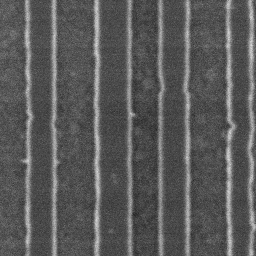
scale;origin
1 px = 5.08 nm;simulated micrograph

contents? one or a few lines or trenches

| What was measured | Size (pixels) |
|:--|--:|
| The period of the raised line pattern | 66.3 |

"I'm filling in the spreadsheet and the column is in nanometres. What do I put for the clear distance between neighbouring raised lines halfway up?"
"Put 202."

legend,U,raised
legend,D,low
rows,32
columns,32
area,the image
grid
DDDUUUUDDDDDUUUUDDDDUUUUDDDDDUUD
DDDUUUUDDDDDUUUUDDDDUUUUDDDDUUUD
DDDUUUUDDDDDUUUUDDDDUUUUDDDDUUUU
DDDUUUUDDDDDUUUUDDDDUUUUDDDDUUUU
DDDUUUUDDDDDUUUUDDDDUUUDDDDDDUUU
DDDUUUUDDDDDUUUUDDDDUUUUDDDDDUUD
DDDUUUUDDDDDUUUUDDDDUUUUDDDDDUUD
DDDUUUUDDDDDUUUUDDDDUUUDDDDDDUUD
DDDUUUUDDDDDUUUUDDDDUUUDDDDDDUUD
DDDUUUUDDDDDUUUUDDDDUUUDDDDDDUUD
DDDUUUUDDDDDUUUUDDDDUUUDDDDDDUUU
DDDUUUUDDDDDUUUUDDDDUUUDDDDDDUUU
DDDUUUUDDDDDUUUUDDDDUUUUDDDDDUUD
DDDDUUUDDDDDUUUUDDDDUUUUDDDDDUUD
DDDDUUUDDDDDUUUUDDDDUUUDDDDDDUUU
DDDDUUUDDDDDUUUUDDDDUUUDDDDDDUUU
DDDUUUUDDDDDUUUUDDDDUUUUDDDDDUUU
DDDUUUUDDDDDUUUUDDDDUUUUDDDDDUUD
DDDUUUUDDDDDUUUUDDDDUUUUDDDDUUUD
DDDDUUUDDDDDUUUUDDDDUUUDDDDDUUUD
DDDUUUUDDDDDUUUUDDDDUUUUDDDDDUUU
DDDUUUUDDDDDUUUUDDDDUUUUDDDDDUUU
DDDUUUUDDDDDUUUUDDDDUUUUDDDDDUUD
DDDUUUUDDDDDUUUUDDDDUUUUDDDDDUUD
DDDUUUUDDDDDUUUUDDDDUUUUDDDDDUUD
DDDUUUUDDDDDUUUUDDDDUUUUDDDDUUUD
DDDUUUUDDDDDUUUUDDDDUUUDDDDDUUUU
DDDUUUUDDDDDUUUUDDDDUUUDDDDDDUUU
DDDUUUUDDDDDUUUUDDDDUUUUDDDDDUUU
DDDUUUUDDDDDUUUUDDDDUUUUDDDDDUUU
DDDUUUUDDDDDUUUUDDDDUUUDDDDDDUUD
DDDUUUUDDDDDUUUUDDDDUUUDDDDDDUUD